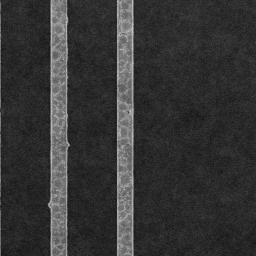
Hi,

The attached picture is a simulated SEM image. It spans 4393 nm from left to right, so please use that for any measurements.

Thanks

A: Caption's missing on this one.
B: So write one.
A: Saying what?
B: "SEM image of one or a few lines or trenches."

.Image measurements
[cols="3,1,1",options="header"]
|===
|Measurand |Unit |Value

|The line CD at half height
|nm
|255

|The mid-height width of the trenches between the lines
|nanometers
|871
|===